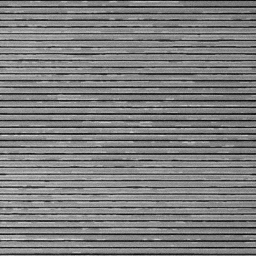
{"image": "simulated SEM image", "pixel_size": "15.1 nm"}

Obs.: parallel lines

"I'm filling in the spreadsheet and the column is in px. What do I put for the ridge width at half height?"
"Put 4.75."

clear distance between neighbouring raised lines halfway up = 30.1 nm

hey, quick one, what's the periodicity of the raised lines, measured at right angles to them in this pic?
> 101 nm